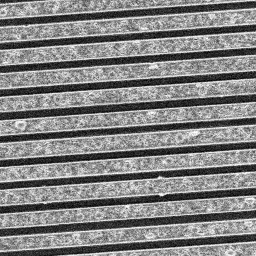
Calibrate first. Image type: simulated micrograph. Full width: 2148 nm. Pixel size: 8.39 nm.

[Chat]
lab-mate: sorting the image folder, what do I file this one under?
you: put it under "parallel lines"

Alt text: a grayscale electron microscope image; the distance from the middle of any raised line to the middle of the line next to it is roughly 195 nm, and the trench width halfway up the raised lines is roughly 0.0658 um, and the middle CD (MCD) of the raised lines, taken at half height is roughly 125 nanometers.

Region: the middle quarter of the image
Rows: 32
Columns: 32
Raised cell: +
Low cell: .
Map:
...........+++++++++++++++++++++
++++++++++++++++++++++++++++++++
++++++++++++++++++++++++++++++++
++++++++++++++++++++++..........
+++++...........................
........................++++++++
..........++++++++++++++++++++++
++++++++++++++++++++++++++++++++
++++++++++++++++++++++++++++++++
++++++++++++++++++..............
++++............................
.......................+++++++++
..........++++++++++++++++++++++
++++++++++++++++++++++++++++++++
+++++++++++++++++++++++++++++++.
+++++++++++++++++...............
+++.............................
...................+++++++++++++
......++++++++++++++++++++++++++
++++++++++++++++++++++++++++++++
++++++++++++++++++++++++++++++..
++++++++++++++++................
++..............................
..................++++++++++++++
.....+++++++++++++++++++++++++++
++++++++++++++++++++++++++++++++
+++++++++++++++++++++++.........
+++++++++.......................
............................++++
..............++++++++++++++++++
.+++++++++++++++++++++++++++++++
++++++++++++++++++++++++++++++++